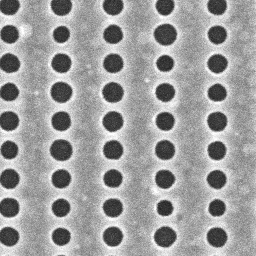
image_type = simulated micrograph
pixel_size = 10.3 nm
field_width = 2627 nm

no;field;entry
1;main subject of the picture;a regular array of holes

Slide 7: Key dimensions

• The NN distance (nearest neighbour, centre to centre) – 28.8 pixels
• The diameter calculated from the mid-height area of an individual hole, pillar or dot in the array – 210 nanometers